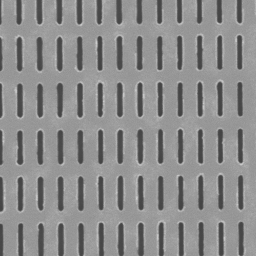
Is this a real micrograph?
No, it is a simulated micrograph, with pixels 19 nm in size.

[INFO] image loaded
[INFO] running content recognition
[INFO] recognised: a regular array of holes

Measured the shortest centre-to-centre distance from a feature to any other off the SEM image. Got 379 nm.